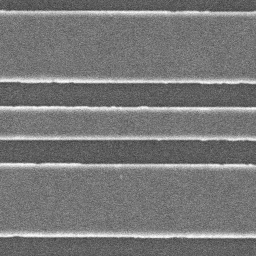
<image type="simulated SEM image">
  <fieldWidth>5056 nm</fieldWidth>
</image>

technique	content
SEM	lines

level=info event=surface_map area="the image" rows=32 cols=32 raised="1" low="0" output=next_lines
00000000000000000000000000000000
11111111111111111111100100000000
11111111111111111111111111111111
11111111111111111111111111111111
11111111111111111111111111111111
11111111111111111111111111111111
11111111111111111111111111111111
11111111111111111111111111111111
11111111111111111111111111111111
11111111111111111111111111111111
00000000000000000000000000000000
00000000000000000000000000000000
00000000000000000000000000000000
11111111111111111111111111111111
11111111111111111111111111111111
11111111111111111111111111111111
11111111111111111111111111111111
00000000000000000000000000000000
00000000000000000000000000000000
00000000000000000000000000000000
11111111110000000000000000000000
11111111111111111111111111111111
11111111111111111111111111111111
11111111111111111111111111111111
11111111111111111111111111111111
11111111111111111111111111111111
11111111111111111111111111111111
11111111111111111111111111111111
11111111111111111111111111111111
11011111111111111111111111111111
00000000000000000000000000000000
00000000000000000000000000000000